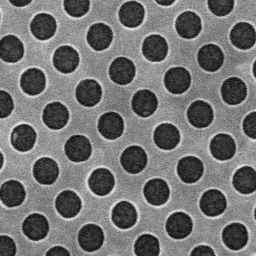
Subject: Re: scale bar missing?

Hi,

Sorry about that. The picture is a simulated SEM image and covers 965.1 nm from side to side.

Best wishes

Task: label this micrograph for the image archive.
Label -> a regular array of holes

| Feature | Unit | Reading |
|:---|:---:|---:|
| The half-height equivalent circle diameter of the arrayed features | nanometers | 106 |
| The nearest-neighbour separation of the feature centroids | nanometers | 150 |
